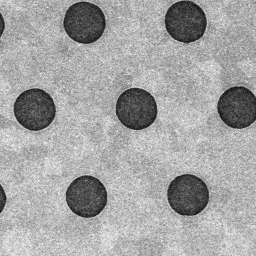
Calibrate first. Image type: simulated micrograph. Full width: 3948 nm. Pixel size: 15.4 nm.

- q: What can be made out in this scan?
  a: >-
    holes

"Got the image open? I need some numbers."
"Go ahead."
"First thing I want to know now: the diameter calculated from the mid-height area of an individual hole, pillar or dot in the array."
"0.653 micrometres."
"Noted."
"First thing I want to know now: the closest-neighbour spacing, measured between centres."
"1550 nanometres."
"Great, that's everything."